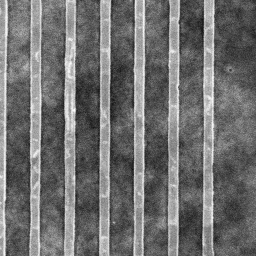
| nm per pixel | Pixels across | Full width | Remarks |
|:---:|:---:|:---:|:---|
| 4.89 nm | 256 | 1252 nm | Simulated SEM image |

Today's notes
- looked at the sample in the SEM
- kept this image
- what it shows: parallel lines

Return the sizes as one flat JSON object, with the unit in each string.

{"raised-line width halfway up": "45.8 nm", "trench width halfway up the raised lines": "124 nanometers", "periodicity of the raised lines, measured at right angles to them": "169 nm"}